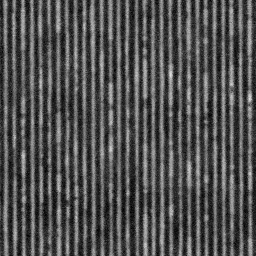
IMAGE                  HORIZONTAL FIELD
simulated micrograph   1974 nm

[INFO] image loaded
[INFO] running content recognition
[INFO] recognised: parallel lines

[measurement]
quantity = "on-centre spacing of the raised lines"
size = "67.2 nanometers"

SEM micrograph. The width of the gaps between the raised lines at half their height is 51.1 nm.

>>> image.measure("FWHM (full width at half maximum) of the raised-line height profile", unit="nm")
14.5